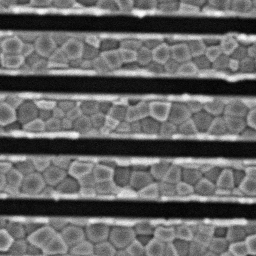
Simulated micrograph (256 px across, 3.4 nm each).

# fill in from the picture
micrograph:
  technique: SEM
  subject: one or a few lines or trenches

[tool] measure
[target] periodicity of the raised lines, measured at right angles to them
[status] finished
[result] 0.211 microns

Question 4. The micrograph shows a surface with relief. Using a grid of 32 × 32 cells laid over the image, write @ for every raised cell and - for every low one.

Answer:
@@@@@@@@@@@@@@@@@@@@@@@@@@@@@@@@
@@@@@@@@@@@@@@@@@@@@@@@@@@@@@@@@
--------------------------------
--------------------------------
@@@@@@@@@@@@@@@@@@@@@@@@@@@@@@@@
@@@@@@@@@@@@@@@@@@@@@@@@@@@@@@@@
@@@@@@@@@@@@@@@@@@@@@@@@@@@@@@@@
@@@@@@@@@@@@@@@@@@@@@@@@@@@@@@@@
@@@@@@@@@@@@@@@@@@@@@@@@@@@@@@@@
-----------------@@@@@@@@@@@@@@@
--------------------------------
--------------------------------
@@@@@@@@@@@@@@@@@@@@@@@@@@@@@@@@
@@@@@@@@@@@@@@@@@@@@@@@@@@@@@@@@
@@@@@@@@@@@@@@@@@@@@@@@@@@@@@@@@
@@@@@@@@@@@@@@@@@@@@@@@@@@@@@@@@
@@@@@@@@@@@@@@@@@@@@@@@@@@@@@@@@
----------------------------@@@@
--------------------------------
-@@@@@--------------------------
@@@@@@@@@@@@@@@@@@@@@@@@@@@@@@@@
@@@@@@@@@@@@@@@@@@@@@@@@@@@@@@@@
@@@@@@@@@@@@@@@@@@@@@@@@@@@@@@@@
@@@@@@@@@@@@@@@@@@@@@@@@@@@@@@@@
@@@@@@@@@@@@@@@@@@@@@@@@@@@@@@@@
--------------------------------
--------------------------------
@@@@@@@@@@@@@@@@@@@@@@@@@@@@@@@-
@@@@@@@@@@@@@@@@@@@@@@@@@@@@@@@@
@@@@@@@@@@@@@@@@@@@@@@@@@@@@@@@@
@@@@@@@@@@@@@@@@@@@@@@@@@@@@@@@@
@@@@@@@@@@@@@@@@@@@@@@@@@@@@@@@@